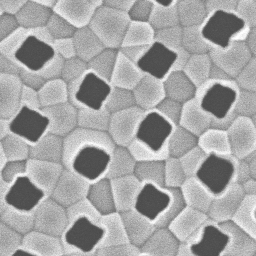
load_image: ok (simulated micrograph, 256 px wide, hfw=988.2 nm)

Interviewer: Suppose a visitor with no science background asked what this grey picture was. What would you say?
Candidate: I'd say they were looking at a regular array of holes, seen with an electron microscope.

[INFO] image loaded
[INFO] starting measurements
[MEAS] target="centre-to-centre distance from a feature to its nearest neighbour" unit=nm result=271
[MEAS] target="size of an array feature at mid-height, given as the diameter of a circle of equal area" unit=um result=0.127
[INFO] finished